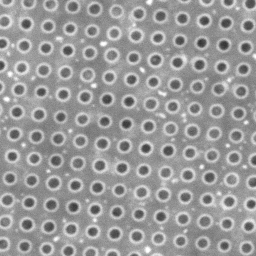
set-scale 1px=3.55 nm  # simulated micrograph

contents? a regular array of holes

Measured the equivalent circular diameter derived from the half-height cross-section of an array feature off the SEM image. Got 0.0407 um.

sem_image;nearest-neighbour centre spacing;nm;77.7